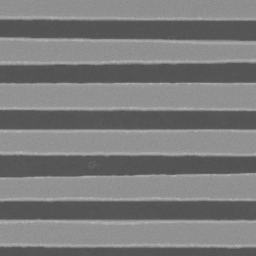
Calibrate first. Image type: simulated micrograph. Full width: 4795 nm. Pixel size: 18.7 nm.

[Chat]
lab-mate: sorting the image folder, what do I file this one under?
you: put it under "lines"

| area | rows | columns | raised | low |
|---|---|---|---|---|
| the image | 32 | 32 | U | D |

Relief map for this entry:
UUUUUUUUUUUUUUUUUUUUUUUUUUUUUUUU
UUUUUUUUUUUUUUUUUUUUUUUUUUUUUUUU
DDDDDDDDDDDUDDDUDUUUUUUUUUUUUUUU
DDDDDDDDDDDDDDDDDDDDDDDDDDDDDDDD
DDDDDDDDDDDDDDDDDDDDDDDDDDDDDDDD
UUUUUUUUUUUUUUUUUUUUUUUUUUUUUUUU
UUUUUUUUUUUUUUUUUUUUUUUUUUUUUUUU
UUUUUUUUUUUUUUUUUUUUUUUUUUUUUUUU
DDDDDDDDDDDDDDDDDDDDDDDDDDDDDDDD
DDDDDDDDDDDDDDDDDDDDDDDDDDDDDDDD
UUDUUUUUUUUUUUUUUUUUUUUUUUUUUUUU
UUUUUUUUUUUUUUUUUUUUUUUUUUUUUUUU
UUUUUUUUUUUUUUUUUUUUUUUUUUUUUUUU
UUUUUUUUUUUUUUUUUUUUUUUUUUUUUUUU
DDDDDDDDDDDDDDDDDDDDDDDDDDDDDDDD
DDDDDDDDDDDDDDDDDDDDDDDDDDDDDDDD
UUUUUUUUUUUUUUUUUUUUUUUUUUUUUUUU
UUUUUUUUUUUUUUUUUUUUUUUUUUUUUUUU
UUUUUUUUUUUUUUUUUUUUUUUUUUUUUUUU
DDDDDDDDDDDDDDDDDDDDDDDDDUDUUUUU
DDDDDDDDDDDDDDDDDDDDDDDDDDDDDDDD
DDDDDDDDDDDDDDDDDDDDDDDDDDDDDDDD
UUUUUUUUUUUUUUUUUUUUUUUUUUUUUUUU
UUUUUUUUUUUUUUUUUUUUUUUUUUUUUUUU
UUUUUUUUUUUUUUUUUUUUUUUUUUUUUUUU
DDDDDDDDDDDDDDDDDDDDDDDDDDDDDDDD
DDDDDDDDDDDDDDDDDDDDDDDDDDDDDDDD
DDDDDDDDDDDDDDDDDDDDDDDDDDDDDDDD
UUUUUUUUUUUUUUUUUUUUUUUUUUUUUUUU
UUUUUUUUUUUUUUUUUUUUUUUUUUUUUUUU
UUUUUUUUUUUUUUUUUUUUUUUUUUUUUUUU
DDDDDDDDDDDDDDDDDDDDDDDDDDDDDDDD